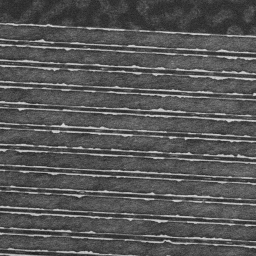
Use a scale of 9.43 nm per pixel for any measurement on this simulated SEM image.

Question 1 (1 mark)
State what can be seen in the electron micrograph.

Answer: parallel lines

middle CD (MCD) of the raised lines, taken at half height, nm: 61.2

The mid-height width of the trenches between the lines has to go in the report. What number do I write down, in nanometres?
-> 139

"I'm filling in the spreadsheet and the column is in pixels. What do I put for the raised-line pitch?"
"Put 20.9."